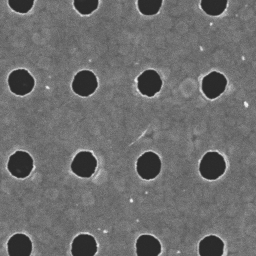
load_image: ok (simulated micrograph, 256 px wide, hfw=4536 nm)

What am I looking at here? a regular array of holes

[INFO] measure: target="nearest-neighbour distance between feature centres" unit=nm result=1130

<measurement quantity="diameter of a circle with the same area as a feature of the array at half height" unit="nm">467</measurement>